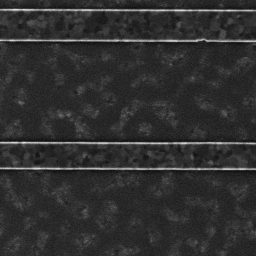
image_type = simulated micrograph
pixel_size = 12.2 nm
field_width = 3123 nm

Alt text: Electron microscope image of one or a few lines or trenches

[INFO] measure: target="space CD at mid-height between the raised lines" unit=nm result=1250